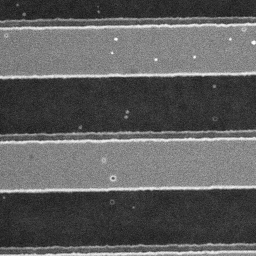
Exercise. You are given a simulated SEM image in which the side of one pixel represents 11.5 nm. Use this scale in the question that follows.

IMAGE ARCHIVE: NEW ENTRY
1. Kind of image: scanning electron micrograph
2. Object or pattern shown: lines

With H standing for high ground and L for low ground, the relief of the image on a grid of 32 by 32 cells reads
LLLLLLLLLLLLLLLLLLLLLLLLLLLLLLLL
LLLLLLLLLLLLLLLLLLLLLLLLLLLLLLLL
LLLLLLHHHLLLHHHHHHHHHHHHHHHHHHHH
HHHHHHHHHHHHHHHHHHHHHHHHHHHHHHHH
HHHHHHHHHHHHHHHHHHHHHHHHHHHHHHHH
HHHHHHHHHHHHHHHHHHHHHHHHHHHHHHHH
HHHHHHHHHHHHHHHHHHHHHHHHHHHHHHHH
HHHHHHHHHHHHHHHHHHHHHHHHHHHHHHHH
HHHHHHHHHHHHHHHHHHHHHHHHHHHHHHHH
HHHHHHHHHHHHHHHHHLLLLLLLLLLLLLLL
LLLLLLLLLLLLLLLLLLLLLLLLLLLLLLLL
LLLLLLLLLLLLLLLLLLLLLLLLLLLLLLLL
LLLLLLLLLLLLLLLLLLLLLLLLLLLLLLLL
LLLLLLLLLLLLLLLLLLLLLLLLLLLLLLLL
LLLLLLLLLLLLLLLLLLLLLLLLLLLLLLLL
LLLLLLLLLLLLLLLLLLLLLLLLLLLLLLLL
LLLLLLLLLLLLLLLLLLLLLLLHLHHHHHHH
HHHHHHHHHHHHHHHHHHHHHHHHHHHHHHHH
HHHHHHHHHHHHHHHHHHHHHHHHHHHHHHHH
HHHHHHHHHHHHHHHHHHHHHHHHHHHHHHHH
HHHHHHHHHHHHHHHHHHHHHHHHHHHHHHHH
HHHHHHHHHHHHHHHHHHHHHHHHHHHHHHHH
HHHHHHHHHHHHHHHHHHHHHHHHHHHHHHHH
HHHHHHHHHHHHHHHHHHHHHHHHHHHHHLLL
LLLLLLLLLLLLLLLLLLLLLLLLLLLLLLLL
LLLLLLLLLLLLLLLLLLLLLLLLLLLLLLLL
LLLLLLLLLLLLLLLLLLLLLLLLLLLLLLLL
LLLLLLLLLLLLLLLLLLLLLLLLLLLLLLLL
LLLLLLLLLLLLLLLLLLLLLLLLLLLLLLLL
LLLLLLLLLLLLLLLLLLLLLLLLLLLLLLLL
LLLLLLLLLLLLLLLLLLLLLLLLLLLLLLLL
HHHHHHHHHHHHHHHHHHHHHHHHHHHHHHHH